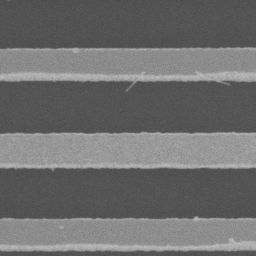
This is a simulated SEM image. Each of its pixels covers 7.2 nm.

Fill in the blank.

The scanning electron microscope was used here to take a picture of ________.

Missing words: lines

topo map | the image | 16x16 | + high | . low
................
................
................
++++++++++++++++
++++++++++++++++
................
................
................
++++++++++++++++
++++++++++++++++
........++.+....
................
................
................
++++++++++++++++
+++++++++++++++.